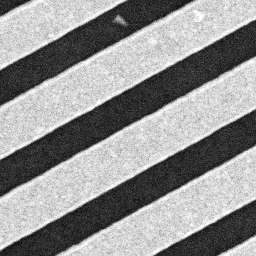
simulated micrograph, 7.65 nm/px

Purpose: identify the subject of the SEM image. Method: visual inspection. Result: lines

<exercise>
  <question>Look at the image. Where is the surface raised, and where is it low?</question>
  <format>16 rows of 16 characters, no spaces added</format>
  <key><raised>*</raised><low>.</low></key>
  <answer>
.******....*****
*****.....*****.
***.....******..
**....******....
....******....**
..******....****
******.....*****
****.....******.
***....******...
*....******....*
...******.....**
..*****.....****
******....******
****....******..
**....******....
.....*****.....*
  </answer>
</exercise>